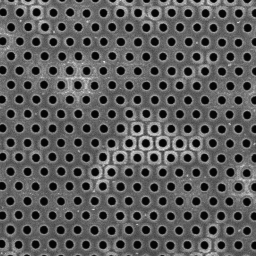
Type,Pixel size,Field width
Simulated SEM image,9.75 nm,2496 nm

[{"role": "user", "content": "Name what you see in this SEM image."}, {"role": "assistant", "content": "a regular array of holes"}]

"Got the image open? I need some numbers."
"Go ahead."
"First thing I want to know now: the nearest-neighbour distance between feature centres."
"159 nm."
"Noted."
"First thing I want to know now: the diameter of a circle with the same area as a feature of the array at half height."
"73.8 nanometers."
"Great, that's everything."